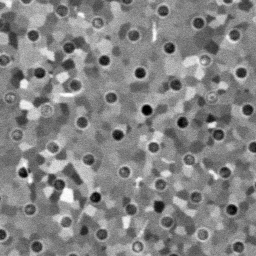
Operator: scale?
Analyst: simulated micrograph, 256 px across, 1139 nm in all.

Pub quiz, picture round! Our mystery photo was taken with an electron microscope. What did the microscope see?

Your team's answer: a regular array of holes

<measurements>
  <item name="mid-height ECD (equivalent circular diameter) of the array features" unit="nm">56.7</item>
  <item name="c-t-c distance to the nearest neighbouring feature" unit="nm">167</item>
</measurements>